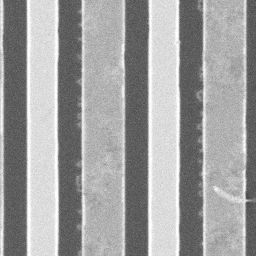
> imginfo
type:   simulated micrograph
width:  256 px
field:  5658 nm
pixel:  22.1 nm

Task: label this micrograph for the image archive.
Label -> lines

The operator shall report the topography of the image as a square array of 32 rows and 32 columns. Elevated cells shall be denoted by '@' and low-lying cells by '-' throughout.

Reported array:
---@@@@---@@@@@@---@@@----@@@@@-
---@@@@---@@@@@@---@@@----@@@@@-
---@@@@---@@@@@@---@@@----@@@@@-
---@@@@---@@@@@@---@@@----@@@@@-
---@@@@---@@@@@@---@@@----@@@@@-
---@@@@---@@@@@----@@@----@@@@@-
---@@@@---@@@@@----@@@----@@@@@-
---@@@@---@@@@@----@@@----@@@@@-
---@@@@---@@@@@----@@@----@@@@@-
---@@@@---@@@@@----@@@----@@@@@-
---@@@@---@@@@@----@@@----@@@@@-
---@@@@---@@@@@----@@@----@@@@@-
---@@@@---@@@@@@---@@@----@@@@@-
---@@@@---@@@@@@---@@@----@@@@@-
---@@@@---@@@@@@---@@@----@@@@@-
---@@@@---@@@@@----@@@----@@@@@-
---@@@@---@@@@@@---@@@----@@@@@-
---@@@@---@@@@@@---@@@----@@@@@-
---@@@@---@@@@@----@@@----@@@@@-
---@@@@---@@@@@----@@@----@@@@@-
---@@@@---@@@@@----@@@----@@@@@-
---@@@@---@@@@@----@@@----@@@@@-
---@@@@---@@@@@----@@@----@@@@@-
---@@@@---@@@@@----@@@----@@@@@-
---@@@@---@@@@@----@@@----@@@@@-
---@@@@---@@@@@@---@@@----@@@@@-
---@@@@---@@@@@@---@@@----@@@@@-
---@@@@---@@@@@@---@@@----@@@@@-
---@@@@---@@@@@@---@@@----@@@@@-
---@@@@---@@@@@@---@@@----@@@@@-
---@@@@---@@@@@@---@@@----@@@@@-
---@@@@---@@@@@----@@@----@@@@@-